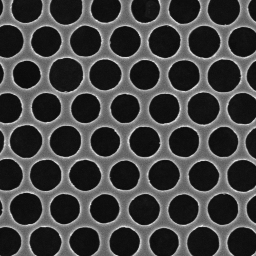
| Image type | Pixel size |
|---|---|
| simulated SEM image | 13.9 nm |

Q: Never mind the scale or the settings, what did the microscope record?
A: a regular array of holes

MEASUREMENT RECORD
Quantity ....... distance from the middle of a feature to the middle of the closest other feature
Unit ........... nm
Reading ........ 537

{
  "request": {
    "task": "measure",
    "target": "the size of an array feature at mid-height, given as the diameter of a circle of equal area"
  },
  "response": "0.43 microns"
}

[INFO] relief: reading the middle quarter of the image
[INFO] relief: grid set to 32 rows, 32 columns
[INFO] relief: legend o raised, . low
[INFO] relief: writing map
....ooo.......ooo......oooo.....
.....oo.......ooo.......oo......
.....o........oo........oo......
.....o........oo........oo......
....ooo.......ooo.......ooo.....
....ooo......ooooo.....oooo.....
...oooooo..oooooooo..ooooooo...o
oooo...ooooooo..oooooooo..oooooo
ooo.....ooooo.....oooo......oooo
oo.......ooo.......ooo.......oo.
oo.......ooo.......oo........oo.
oo.......ooo.......oo........oo.
oo.......ooo.......oo........oo.
ooo.....ooooo.....oooo......ooo.
oooo...ooooooo...oooooo....ooooo
.ooooooooooooooooooooooooooooooo
...ooooo.....ooooo.....ooooo....
....ooo......oooo......oooo.....
....ooo.......oo........oo......
....oo........oo........oo......
....ooo.......oo........oo......
....ooo......oooo......oooo.....
...ooooo....oooooo.....oooo.....
oooooooooooooooooooooooooooooooo
ooo.....ooooo....oooooo....ooooo
oo.......ooo......oooo......oooo
oo.......ooo.......oo........oo.
o........oo........oo........oo.
o........ooo.......oo........oo.
oo.......ooo.......oo........ooo
oo......oooo......oooo......oooo
oooo...oooooooo.oooooooo..oooooo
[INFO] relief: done